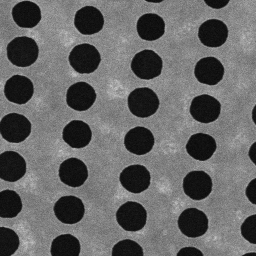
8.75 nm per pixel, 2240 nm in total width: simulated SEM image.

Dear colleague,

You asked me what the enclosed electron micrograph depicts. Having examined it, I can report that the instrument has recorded a regular array of holes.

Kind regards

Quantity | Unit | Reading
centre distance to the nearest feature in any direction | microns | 0.332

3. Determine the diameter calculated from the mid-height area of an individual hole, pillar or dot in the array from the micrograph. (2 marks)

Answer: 259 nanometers